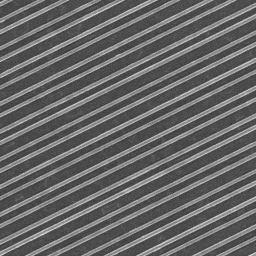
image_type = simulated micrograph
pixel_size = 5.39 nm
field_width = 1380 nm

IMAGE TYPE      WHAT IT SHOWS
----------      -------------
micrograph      parallel lines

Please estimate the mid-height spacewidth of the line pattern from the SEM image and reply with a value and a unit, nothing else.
0.0404 um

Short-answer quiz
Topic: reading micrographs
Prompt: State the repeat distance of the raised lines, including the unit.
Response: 66.7 nm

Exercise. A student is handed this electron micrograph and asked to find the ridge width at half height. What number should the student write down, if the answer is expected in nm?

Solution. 18.1